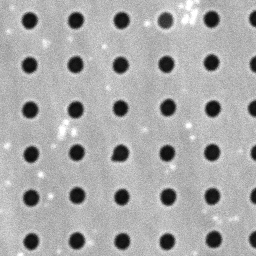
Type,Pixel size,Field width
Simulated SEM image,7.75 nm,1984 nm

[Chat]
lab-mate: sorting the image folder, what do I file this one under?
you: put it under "a regular array of holes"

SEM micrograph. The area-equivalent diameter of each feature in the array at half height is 134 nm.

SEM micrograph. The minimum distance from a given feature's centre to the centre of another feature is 0.338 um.